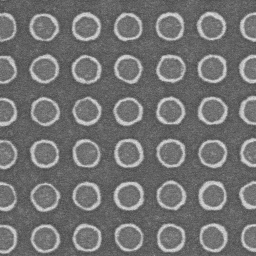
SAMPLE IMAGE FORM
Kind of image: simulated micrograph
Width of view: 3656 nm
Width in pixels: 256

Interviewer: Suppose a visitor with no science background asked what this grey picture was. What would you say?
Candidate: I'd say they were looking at a regular array of raised bodies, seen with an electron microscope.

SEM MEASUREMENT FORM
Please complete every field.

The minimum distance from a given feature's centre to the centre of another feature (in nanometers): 593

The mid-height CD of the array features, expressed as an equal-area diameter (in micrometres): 0.376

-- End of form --